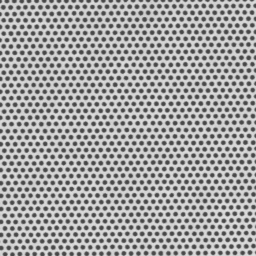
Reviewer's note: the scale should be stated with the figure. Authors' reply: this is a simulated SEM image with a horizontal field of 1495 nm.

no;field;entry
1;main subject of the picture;a regular array of holes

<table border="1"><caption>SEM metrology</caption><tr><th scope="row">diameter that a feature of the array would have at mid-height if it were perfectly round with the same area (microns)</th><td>0.028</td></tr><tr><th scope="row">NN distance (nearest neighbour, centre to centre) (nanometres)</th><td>40.7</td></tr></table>